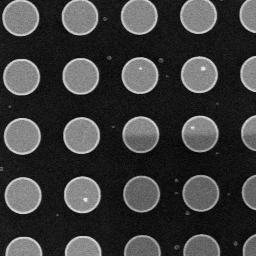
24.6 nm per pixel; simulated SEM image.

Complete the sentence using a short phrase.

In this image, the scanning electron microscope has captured an array of small figures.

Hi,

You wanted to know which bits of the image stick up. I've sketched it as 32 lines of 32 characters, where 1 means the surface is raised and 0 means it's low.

01110000111100001110000111100011
11111000111100011111000111100011
11111000111100011111000111100011
01110000111100001110000111000001
00000000000000000000000000000000
00000000000000000000000000000000
00000000000000000000000000000000
00100000011000001110000011000001
01111000111100011111000111100011
11111000111100011111000111100011
01111000111100011110000111100011
01110000011000000100000011000000
00000000000000000000000000000000
00000000000000000000000000000000
00000000000000000000000000000000
01110000111100001110000111100011
01111000111100011111000111100011
11111000111100011111000111100011
01111000011100001110000011000001
00000000000000000000000000000000
00000000000000000000000000000000
00000000000000000000000000000000
00110000011100001110000011100001
01111000111100001111000111100011
01111000111110011111000111100011
01111000111100001111000111100001
00110000011000000100000000000000
00000000000000000000000000000000
00000000000000000000000000000000
00000000000000000110000011000000
01111000011100001111000111100001
01111000111110001111000111100011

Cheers